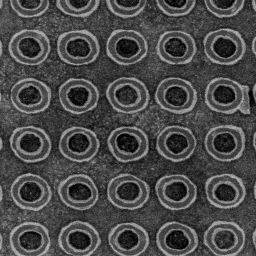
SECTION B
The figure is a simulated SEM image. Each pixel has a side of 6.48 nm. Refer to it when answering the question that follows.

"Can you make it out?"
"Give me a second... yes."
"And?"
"a regular array of ring-shaped raised bodies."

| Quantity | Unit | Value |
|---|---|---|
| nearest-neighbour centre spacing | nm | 306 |